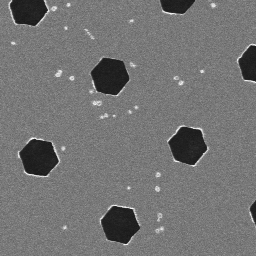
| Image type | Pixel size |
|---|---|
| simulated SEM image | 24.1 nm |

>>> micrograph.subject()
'holes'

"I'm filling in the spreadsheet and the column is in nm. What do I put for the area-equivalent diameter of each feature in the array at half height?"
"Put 886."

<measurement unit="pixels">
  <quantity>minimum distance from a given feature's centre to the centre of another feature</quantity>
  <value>104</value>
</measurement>